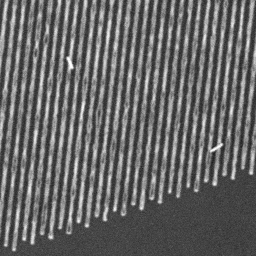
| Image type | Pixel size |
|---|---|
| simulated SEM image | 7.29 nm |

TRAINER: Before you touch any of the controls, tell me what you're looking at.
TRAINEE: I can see parallel lines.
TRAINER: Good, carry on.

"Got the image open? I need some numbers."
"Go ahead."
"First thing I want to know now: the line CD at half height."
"19.9 nm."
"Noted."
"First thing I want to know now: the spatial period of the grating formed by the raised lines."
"0.0637 µm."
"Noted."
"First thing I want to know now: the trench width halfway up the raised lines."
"38.9 nm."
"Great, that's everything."